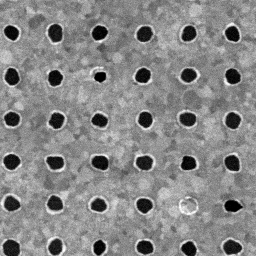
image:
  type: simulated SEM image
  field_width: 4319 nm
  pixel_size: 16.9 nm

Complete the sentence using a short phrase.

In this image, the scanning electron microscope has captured a regular array of holes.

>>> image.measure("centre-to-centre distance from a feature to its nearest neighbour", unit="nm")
716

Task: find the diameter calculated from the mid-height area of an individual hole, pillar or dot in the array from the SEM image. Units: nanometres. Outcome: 278